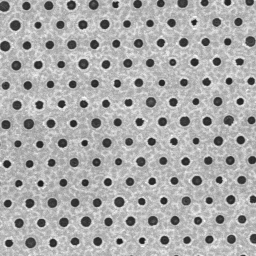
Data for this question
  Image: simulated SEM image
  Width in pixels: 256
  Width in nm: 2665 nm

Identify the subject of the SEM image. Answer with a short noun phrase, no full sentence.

a regular array of holes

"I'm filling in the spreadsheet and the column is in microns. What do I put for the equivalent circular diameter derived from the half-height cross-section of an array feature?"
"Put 0.0895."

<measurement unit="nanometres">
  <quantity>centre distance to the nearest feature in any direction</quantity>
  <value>229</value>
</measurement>